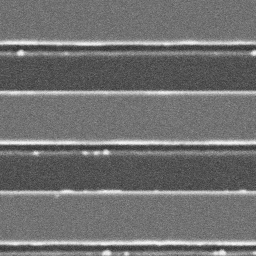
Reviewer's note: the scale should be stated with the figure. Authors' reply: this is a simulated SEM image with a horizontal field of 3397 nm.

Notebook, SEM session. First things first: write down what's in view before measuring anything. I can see lines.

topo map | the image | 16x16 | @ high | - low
@@@@@@@@@@@@@@@@
@@@@@@@@@@@@@@@@
@@@@@@@@@@@@@@@@
----------------
----------------
----------------
@@@@@@@@@@@@@@@@
@@@@@@@@@@@@@@@@
@@@@@@@@@@@@@@@@
----------------
----------------
----------------
@@@@@@@@@@@@@@@@
@@@@@@@@@@@@@@@@
@@@@@@@@@@@@@@@@
----------------